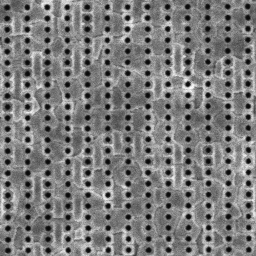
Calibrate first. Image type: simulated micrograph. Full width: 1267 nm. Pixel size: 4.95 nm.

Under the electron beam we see a regular array of holes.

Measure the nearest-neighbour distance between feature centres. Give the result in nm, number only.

54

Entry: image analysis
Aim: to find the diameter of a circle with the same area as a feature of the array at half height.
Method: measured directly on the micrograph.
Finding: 27.3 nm